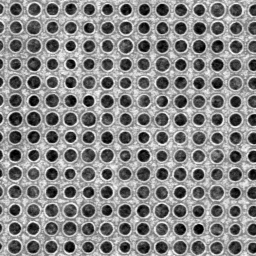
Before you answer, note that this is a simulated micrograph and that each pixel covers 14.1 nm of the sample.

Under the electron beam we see a regular array of holes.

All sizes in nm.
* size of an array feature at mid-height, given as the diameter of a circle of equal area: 182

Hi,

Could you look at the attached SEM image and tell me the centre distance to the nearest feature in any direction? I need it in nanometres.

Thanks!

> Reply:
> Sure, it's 256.